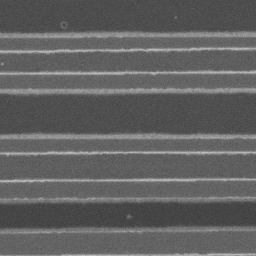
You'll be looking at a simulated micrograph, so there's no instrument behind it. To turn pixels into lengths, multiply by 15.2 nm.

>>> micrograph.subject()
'lines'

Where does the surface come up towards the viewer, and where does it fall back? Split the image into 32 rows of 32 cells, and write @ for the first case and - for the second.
--------------------------------
--------------------------------
--------------------------------
--------------------------------
----------------------@@@@@@@@@@
@@@@@@@@@@@@@@@@@@@@@@@@@@@@@@@@
@@@@@@@@@@@@@@@@@@@@@@@@@@@@@@@@
@@@@@@@@@@@@@@@@@@@@@@@@@@@@@@@@
@@@@@@@@@@@@@@@@@@@@@@@@@@@@@@@@
@@@@@@@@@@@@@@@@@@@@@@@@@@@@@@@@
@@@@@@@@@@@@@@@@@@@@@@@@@@@@@@@@
--------------------------------
--------------------------------
--------------------------------
--------------------------------
--------------------------------
--------------------------------
@@@@@@@@@@@@@@@@@@@@@@@@@@@@@@@@
@@@@@@@@@@@@@@@@@@@@@@@@@@@@@@@@
@@@@@@@@@@@@@@@@@@@@@@@@@@@@@@@@
@@@@@@@@@@@@@@@@@@@@@@@@@@@@@@@@
@@@@@@@@@@@@@@@@@@@@@@@@@@@@@@@@
@@@@@@@@@@@@@@@@@@@@@@@@@@@@@@@@
@@@@@@@@@@@@@@@@@@@@@@@@@@@@@@@@
@@@@@@@@@@@@@@@@@@@@@@@@@@@@@@@@
--------------------------------
--------------------------------
--------------------------------
--------------------------------
@@@@@@@@@@@@@@@@@@@@@@@@@@@@@@@@
@@@@@@@@@@@@@@@@@@@@@@@@@@@@@@@@
@@@@@@@@@@@@@@@@@@@@@@@@@@@@@@@@